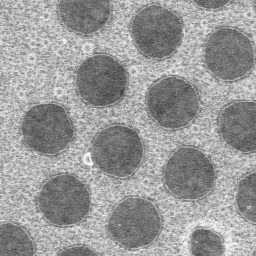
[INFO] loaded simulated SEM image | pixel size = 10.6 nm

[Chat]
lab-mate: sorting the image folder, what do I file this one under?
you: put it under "a regular array of raised bodies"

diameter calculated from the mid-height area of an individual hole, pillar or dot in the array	557	nm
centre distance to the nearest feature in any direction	775	nm